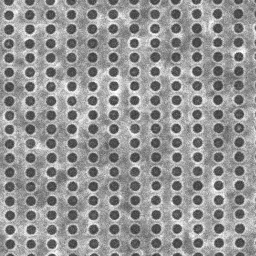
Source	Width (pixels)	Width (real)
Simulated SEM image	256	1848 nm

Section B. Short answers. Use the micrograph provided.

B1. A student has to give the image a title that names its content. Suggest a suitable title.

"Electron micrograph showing a regular array of holes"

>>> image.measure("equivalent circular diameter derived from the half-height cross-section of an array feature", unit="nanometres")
76.4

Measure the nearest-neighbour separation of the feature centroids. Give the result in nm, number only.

101